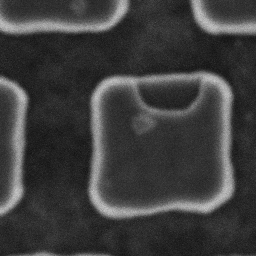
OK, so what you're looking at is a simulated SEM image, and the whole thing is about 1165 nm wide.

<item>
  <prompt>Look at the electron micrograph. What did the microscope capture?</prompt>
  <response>raised bodies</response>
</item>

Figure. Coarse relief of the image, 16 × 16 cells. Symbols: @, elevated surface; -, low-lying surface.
@@@@@@@@----@@@@
@@@@@@@------@@@
----------------
----------------
----------------
@-----@@@@@@@@--
@-----@@@@@@@@--
@-----@@@@@@@@--
@-----@@@@@@@@--
@-----@@@@@@@@--
@-----@@@@@@@@--
@-----@@@@@@@@--
@-----@@@@@@@@--
----------------
----------------
----------------